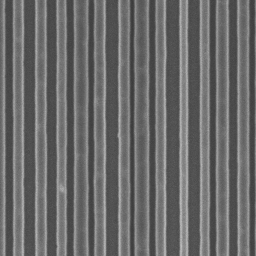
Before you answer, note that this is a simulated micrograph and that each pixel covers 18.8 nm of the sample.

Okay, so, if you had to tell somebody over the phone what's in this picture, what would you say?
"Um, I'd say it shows parallel lines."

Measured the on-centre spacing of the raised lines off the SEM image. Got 384 nanometres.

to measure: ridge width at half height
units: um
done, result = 0.19